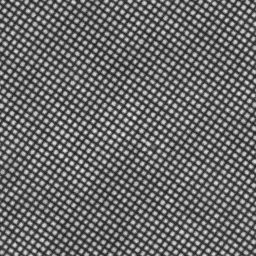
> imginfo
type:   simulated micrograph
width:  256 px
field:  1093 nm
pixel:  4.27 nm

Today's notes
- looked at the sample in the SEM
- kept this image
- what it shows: a regular array of raised bodies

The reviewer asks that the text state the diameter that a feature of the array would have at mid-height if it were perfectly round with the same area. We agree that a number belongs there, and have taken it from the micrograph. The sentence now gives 19.3 nm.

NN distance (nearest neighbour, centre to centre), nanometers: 27.2